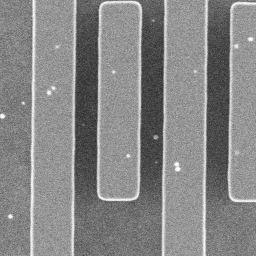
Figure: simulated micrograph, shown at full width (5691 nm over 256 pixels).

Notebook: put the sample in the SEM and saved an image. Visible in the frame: groups of lines, slits or small figures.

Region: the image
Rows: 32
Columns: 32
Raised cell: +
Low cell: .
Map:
....+++++....++++....+++++...+++
....+++++...++++++...+++++...+++
....+++++...++++++...+++++...+++
....+++++...++++++...+++++...+++
....+++++...++++++...+++++...+++
....+++++...++++++...+++++...+++
....+++++...++++++...+++++...+++
....+++++...++++++...+++++...+++
....+++++...++++++...+++++...+++
....+++++...++++++...+++++...+++
....+++++...++++++...+++++...+++
....+++++...++++++...+++++...+++
....+++++...++++++...+++++...+++
....+++++...++++++...+++++...+++
....+++++...++++++...+++++...+++
....+++++...++++++...+++++...+++
....+++++...+++++....+++++...+++
....+++++...+++++....+++++...+++
....+++++...+++++....+++++...+++
....+++++...+++++...++++++...+++
....+++++...+++++...++++++...+++
....+++++...+++++...++++++...+++
....+++++...+++++...++++++...+++
....+++++...+++++...++++++...+++
....+++++...+++++...++++++...+++
....+++++...........++++++......
....+++++...........++++++......
....+++++...........++++++......
....+++++...........++++++......
....+++++...........++++++......
....+++++...........++++++......
....+++++...........++++++......